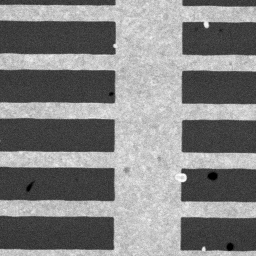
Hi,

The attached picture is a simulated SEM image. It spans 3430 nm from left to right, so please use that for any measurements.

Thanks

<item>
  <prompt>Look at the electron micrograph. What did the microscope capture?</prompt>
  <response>groups of lines, slits or small figures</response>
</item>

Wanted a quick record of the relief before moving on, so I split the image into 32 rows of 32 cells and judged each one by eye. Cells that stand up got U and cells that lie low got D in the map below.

DDDDDDDDDDDDDDUUUUUUUUUDDDDDDDDD
UUUUUUUUUUUUUUUUUUUUUUUUUUUUUUUU
DDUUDUUUUUUUUUUUUUUUUUUUUUUUUUUU
DDDDDDDDDDDDDDDUUUUUUUUDDDDDDDDD
DDDDDDDDDDDDDDDUUUUUUUUDDDDDDDDD
DDDDDDDDDDDDDDUUUUUUUUUDDDDDDDDD
DDDDDDDDDDDDDDUUUUUUUUUDDDDDDDDD
UUUUUUUUUUUUUUUUUUUUUUUUUUUUUUUU
UUUUUUUUUUUUUUUUUUUUUUUUUUUUUUUU
DDDDDDDDDDDDDDDUUUUUUUUDDDDDDDDD
DDDDDDDDDDDDDDUUUUUUUUUDDDDDDDDD
DDDDDDDDDDDDDDUUUUUUUUUDDDDDDDDD
DDDDDDDDDDDDDDDUUUUUUUUDDDDDDDDD
UUUUUUUUUUUUUUUUUUUUUUUUUUUUUUUU
UUUUUUUUUUUUUUUUUUUUUUUUUUUUUUUU
DDDDDDDDDDDDDDUUUUUUUUUDDDDDDDDD
DDDDDDDDDDDDDDUUUUUUUUUDDDDDDDDD
DDDDDDDDDDDDDDDUUUUUUUUDDDDDDDDD
DDDDDDDDDDDDDDUUUUUUUUUDDDDDDDDD
UUUUUUUUUUUUUUUUUUUUUUUUUUUUUUUU
UUUUUUUUUUUUUUUUUUUUUUUUUUUUUUUU
DDDDDDDDDDDDDDDUUUUUUUUDDDDDDDDD
DDDDDDDDDDDDDDUUUUUUUUUDDDDDDDDD
DDDDDDDDDDDDDDUUUUUUUUUDDDDDDDDD
DDDDDDDDDDDDDDUUUUUUUUUDDDDDDDDD
UUUUUUUUUUUUUUUUUUUUUUUUUUUUUUUU
UUUUUUUUUUUUUUUUUUUUUUUUUUUUUUUU
DDDDDDDDDDDDDDUUUUUUUUUDDDDDDDDD
DDDDDDDDDDDDDDUUUUUUUUUDDDDDDDDD
DDDDDDDDDDDDDDUUUUUUUUUDDDDDDDDD
DDDDDDDDDDDDDDUUUUUUUUDDDDDDDDDD
UUUUUUUUUUUUUUUUUUUUUUUUUUDUDDDU